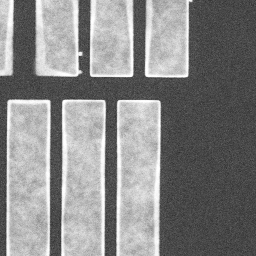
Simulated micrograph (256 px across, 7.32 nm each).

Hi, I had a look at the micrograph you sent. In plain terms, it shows groups of lines, slits or small figures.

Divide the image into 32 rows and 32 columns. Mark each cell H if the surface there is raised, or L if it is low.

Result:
HLLLLHHHHLLLHHHHLLLHHHHLLLLLLLLL
HLLLLHHHHLLLHHHHLLLHHHHLLLLLLLLL
HLLLLHHHHLLLHHHHLLLHHHHLLLLLLLLL
HLLLLHHHHHLHHHHHLLLHHHHLLLLLLLLL
HLLLLHHHHHLHHHHHLLHHHHHLLLLLLLLL
HLLLLHHHHHLHHHHHHLHHHHHLLLLLLLLL
HLLLLHHHHHLHHHHHHLHHHHHLLLLLLLLL
HLLLLHHHHHLHHHHHHLHHHHHLLLLLLLLL
HLLLLHHHHHLHHHHHHLHHHHHLLLLLLLLL
LLLLLLLLLLLLLLHHLLLHHHHLLLLLLLLL
LLLLLLLLLLLLLLLLLLLLLLLLLLLLLLLL
LLLLLLLLLLLLLLLLLLLLLLLLLLLLLLLL
LLLLLLLLLLLLLLLLLLLLLLLLLLLLLLLL
LHHHHHLLHHHHHLLHHHHHLLLLLLLLLLLL
LHHHHHLLHHHHHLLHHHHHLLLLLLLLLLLL
LHHHHHLLHHHHHLLHHHHHLLLLLLLLLLLL
LHHHHHLLHHHHHLLHHHHHLLLLLLLLLLLL
LHHHHHLLHHHHHLLHHHHHLLLLLLLLLLLL
LHHHHHLLHHHHHLLHHHHHLLLLLLLLLLLL
LHHHHHLLHHHHHLLHHHHHLLLLLLLLLLLL
LHHHHHLLHHHHHLLHHHHHLLLLLLLLLLLL
LHHHHHLLHHHHHLLHHHHHLLLLLLLLLLLL
LHHHHHLLHHHHHLLHHHHHLLLLLLLLLLLL
LHHHHHLLHHHHHLLHHHHHLLLLLLLLLLLL
LHHHHHLLHHHHHLLHHHHHLLLLLLLLLLLL
LHHHHHLLHHHHHLLHHHHHLLLLLLLLLLLL
LHHHHHLLHHHHHLLHHHHHLLLLLLLLLLLL
LHHHHHLLHHHHHLLHHHHHLLLLLLLLLLLL
LHHHHHLLHHHHHLLHHHHHLLLLLLLLLLLL
LHHHHHLLHHHHHLLHHHHHLLLLLLLLLLLL
LHHHHHLLHHHHHLLHHHHHLLLLLLLLLLLL
LHHHHHLLHHHHHLLHHHHHLLLLLLLLLLLL